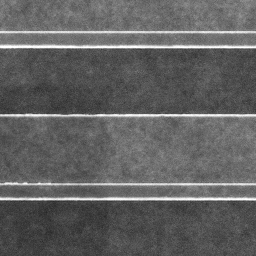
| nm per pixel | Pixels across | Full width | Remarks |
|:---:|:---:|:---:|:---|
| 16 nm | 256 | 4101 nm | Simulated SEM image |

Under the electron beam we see lines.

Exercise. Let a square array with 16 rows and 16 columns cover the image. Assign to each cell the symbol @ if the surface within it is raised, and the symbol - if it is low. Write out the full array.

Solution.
@@@@@@@@@@@@@@@@
@@@@@@@@@@@@@@@@
@@@@@@@@@@@@@@@@
----------------
----------------
----------------
----------------
@@@@@@@@@@@@@@@@
@@@@@@@@@@@@@@@@
@@@@@@@@@@@@@@@@
@@@@@@@@@@@@@@@@
@@@@@@@@@@@@@@@@
----------------
----------------
----------------
----------------